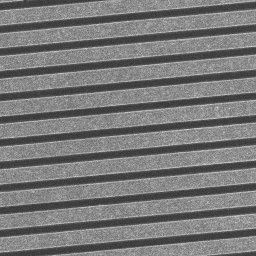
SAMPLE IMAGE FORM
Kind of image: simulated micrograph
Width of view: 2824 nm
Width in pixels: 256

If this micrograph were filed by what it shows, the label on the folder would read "parallel lines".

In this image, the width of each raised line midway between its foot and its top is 169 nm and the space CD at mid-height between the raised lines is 79.6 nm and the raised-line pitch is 22.6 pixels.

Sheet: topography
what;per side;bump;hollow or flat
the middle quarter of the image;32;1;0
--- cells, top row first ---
00000000000000000011111111111111
00000001111111111111111111111111
11111111111111111111111111111111
11111111111111111111111110000000
11111111111111000000000000000000
11110000000000000000000001111111
00000000000000111111111111111111
00001111111111111111111111111111
11111111111111111111111111111111
11111111111111111111100000000000
11111111111000000000000000000000
00000000000000000000011111111111
00000000000111111111111111111111
11111111111111111111111111111111
11111111111111111111111111110000
11111111111111111100000000000000
11111110000000000000000000001111
00000000000000000011111111111111
00000001111111111111111111111111
11111111111111111111111111111111
11111111111111111111111110000000
11111111111111000000000000000000
11100000000000000000000001111111
00000000000000111111111111111111
00011111111111111111111111111111
11111111111111111111111111111111
11111111111111111111100000000000
11111111110000000000000000000000
11000000000000000000011111111111
00000000001111111111111111111111
11111111111111111111111111111111
11111111111111111111111111111100